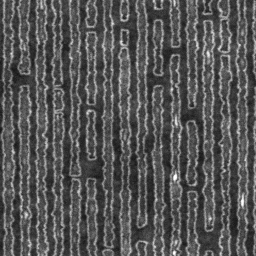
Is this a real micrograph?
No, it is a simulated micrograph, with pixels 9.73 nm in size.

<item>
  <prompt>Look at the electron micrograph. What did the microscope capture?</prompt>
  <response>parallel lines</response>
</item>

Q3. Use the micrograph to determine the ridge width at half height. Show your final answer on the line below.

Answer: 94.9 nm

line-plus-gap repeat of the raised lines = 0.163 um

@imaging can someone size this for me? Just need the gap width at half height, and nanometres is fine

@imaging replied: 69.3